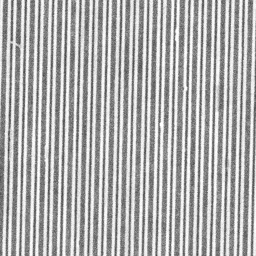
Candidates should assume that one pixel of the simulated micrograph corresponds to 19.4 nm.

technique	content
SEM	parallel lines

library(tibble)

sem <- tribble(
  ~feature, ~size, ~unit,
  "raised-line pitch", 0.132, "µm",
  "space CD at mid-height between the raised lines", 0.102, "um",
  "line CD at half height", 0.051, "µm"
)